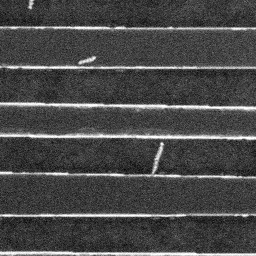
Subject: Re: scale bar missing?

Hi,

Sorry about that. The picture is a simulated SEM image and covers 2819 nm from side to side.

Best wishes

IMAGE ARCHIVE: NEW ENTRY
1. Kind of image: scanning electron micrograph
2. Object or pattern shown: lines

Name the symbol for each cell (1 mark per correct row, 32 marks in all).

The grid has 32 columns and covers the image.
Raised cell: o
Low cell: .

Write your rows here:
................................
................................
................................
ooooooooooo...o.................
oooooooooooooooooooooooooooooooo
oooooooooooooooooooooooooooooooo
oooooooooooooooooooooooooooooooo
oooooooooooooooooooooooooooooooo
................................
................................
................................
................................
................................
ooooooooooooooooooooooooooooooo.
oooooooooooooooooooooooooooooooo
oooooooooooooooooooooooooooooooo
oooooooooooooooooooooooooooooooo
................................
................................
................................
................................
................................
oooooooooooooooooooooooooooooooo
oooooooooooooooooooooooooooooooo
oooooooooooooooooooooooooooooooo
oooooooooooooooooooooooooooooooo
oooooooooooooooooooooooooooooooo
................................
................................
................................
................................
................................